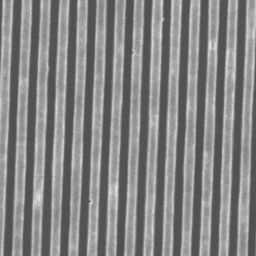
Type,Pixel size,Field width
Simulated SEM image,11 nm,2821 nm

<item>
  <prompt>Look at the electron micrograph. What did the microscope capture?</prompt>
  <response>parallel lines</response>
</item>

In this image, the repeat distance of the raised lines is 207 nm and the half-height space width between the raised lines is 95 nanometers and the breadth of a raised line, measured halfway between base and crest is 10.4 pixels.